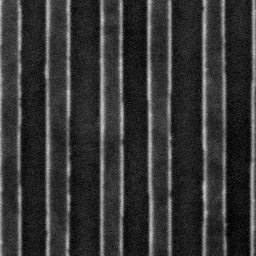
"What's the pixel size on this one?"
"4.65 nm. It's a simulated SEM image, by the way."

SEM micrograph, lines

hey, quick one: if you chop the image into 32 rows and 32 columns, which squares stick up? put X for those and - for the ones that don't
XXX---XXX----XX----XX-----XX----
XXX---XXX----XX----XX-----XX----
XXX---XXX----XX----XX----XXX----
XXX---XXX----XX----XX----XXX----
XXX---XXX----XX----XX----XXX----
XXX---XXX----XX----XX----XXX----
XXX---XXX----XX----XX----XXX----
XX----XXX----XX----XX----XXX----
XXX---XXX----XX----XX----XXX----
XXX---XXX----XX----XX----XXX----
XXX---XXX----XX----XX----XXX----
XXX---XXX----XX----XX----XXX----
XXX---XXX----XX----XX----XXX----
XX----XXX----XX----XX----XXX----
XXX---XXX----XX----XX----XXX----
XXX---XXX----XX----XX----XXX----
XX----XXX----XX----XX-----XX----
XX----XXX----XX----XX-----XX----
XX----XXX----XX----XX-----XX----
XX----XXX----XX----XX-----XX----
XX----XXX----XX----XX-----XX----
XX----XXX----XX----XX-----XX---X
XX----XXX----XX----XX-----XX---X
XXX---XXX----XX----XX-----XX---X
XXX---XXX----XX----XX-----XX---X
XXX---XXX----XX----XX-----XX----
XXX---XXX----XX----XX-----XX----
XXX---XXX----XX----XX-----XX----
XXX---XXX----XX----XX----XXX---X
XXX---XXX----XX----XX----XXX---X
XXX---XXX----XX----XX----XXX---X
XXX---XXX----XX----XX----XXX---X